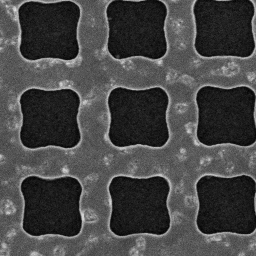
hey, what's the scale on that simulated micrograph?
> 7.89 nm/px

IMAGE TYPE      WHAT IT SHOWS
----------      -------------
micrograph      holes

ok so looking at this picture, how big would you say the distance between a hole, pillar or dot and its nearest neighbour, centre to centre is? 0.692 um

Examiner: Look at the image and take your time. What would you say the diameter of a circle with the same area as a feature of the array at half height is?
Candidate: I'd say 508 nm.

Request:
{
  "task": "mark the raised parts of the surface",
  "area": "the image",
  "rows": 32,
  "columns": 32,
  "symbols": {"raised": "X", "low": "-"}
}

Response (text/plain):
XXX------XXXXX------XXXX--------
XX--------XXX--------XXX--------
XX--------XXX--------XXX--------
XXX-------XXXX-------XXX--------
XXX-------XXX--------XXX--------
XXX-------XXX--------XXX--------
XXX-------XXXX-------XXXX-------
XXXXXXXX-XXXXXXXXXXXXXXXXXXXXXXX
XXXXXXXXXXXXXXXXXXXXXXXXXXXXXXXX
XXXXXXXXXXXXXXXXXXXXXXXXXXXXXXXX
XXXXXXXXXXXXXXXXXXXXXXXXXXXXXXXX
XXX------XXXXX-------XXXX-------
XXX-------XXXX-------XXXX-------
XXX-------XXXX-------XXXX-------
XXX-------XXXX-------XXXX-------
XXX-------XXXX-------XXXX-------
XXX-------XXXX-------XXXX-------
XXX-------XXXX-------XXXX-------
XXXX-XXXXXXXXXXXXXXXXXXXXXXXXXXX
XXXXXXXXXXXXXXXXXXXXXXXXXXXXXXXX
XXXXXXXXXXXXXXXXXXXXXXXXXXXXXXXX
XXXXXXXXXXXXXXXXXXXXXXXXXXXXXXXX
XXX-------XXXX-------XXXX-------
XXX-------XXXX-------XXXX-------
XXX-------XXXX-------XXXX-------
XXX-------XXXX-------XXXX-------
XXX-------XXXX-------XXXX-------
XXX-------XXXX-------XXXX-------
XXX-------XXXX-------XXXX-------
XXXX-XXX-XXXXXXXXXXXXXXXXXXXXXXX
XXXXXXXXXXXXXXXXXXXXXXXXXXXXXXXX
XXXXXXXXXXXXXXXXXXXXXXXXXXXXXXXX